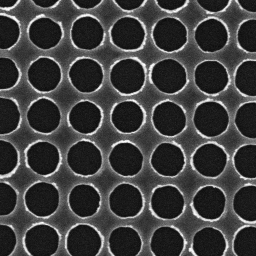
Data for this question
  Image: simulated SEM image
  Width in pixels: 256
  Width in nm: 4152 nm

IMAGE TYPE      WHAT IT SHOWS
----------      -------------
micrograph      a regular array of holes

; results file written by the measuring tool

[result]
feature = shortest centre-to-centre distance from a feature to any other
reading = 671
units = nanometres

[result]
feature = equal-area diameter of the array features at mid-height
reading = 551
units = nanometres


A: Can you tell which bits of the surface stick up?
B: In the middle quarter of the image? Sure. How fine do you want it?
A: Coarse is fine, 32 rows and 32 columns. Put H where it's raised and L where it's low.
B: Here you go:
HHLLLLLLLHHHLLLLLLLLHHLLLLLLLLHH
HLLLLLLLLLHHLLLLLLLLHHLLLLLLLLHH
HLLLLLLLLLHLLLLLLLLLHHLLLLLLLLLH
HLLLLLLLLLHLLLLLLLLLHHLLLLLLLLLH
HHLLLLLLLLHHLLLLLLLLHHLLLLLLLLLH
HHLLLLLLLHHHLLLLLLLLHHHLLLLLLLHH
HHHLLLLLHHHHHLLLLLLHHHHHLLLLLHHH
HHHHHHHHHHHHHHHLHHHHHHHHHHLHHHHH
HHHHHHHHHHHHHHHHHHHHHHHHHHHHHHHH
HHHHLLLHHHHHHHHLLLHHHHHHHLLHHHHH
HHHLLLLLHHHHHLLLLLLHHHHLLLLLLHHH
HHLLLLLLLHHHLLLLLLLHHHLLLLLLLLHH
HLLLLLLLLHHHLLLLLLLLHHLLLLLLLLHH
HLLLLLLLLHHHLLLLLLLLHHLLLLLLLLLH
HLLLLLLLLHHHLLLLLLLLHHLLLLLLLLLH
HHLLLLLLLHHHHLLLLLLHHHHLLLLLLLHH
HHHLLLLLHHHHHHLLLLHHHHHLLLLLLLHH
HHHHHLHHHHHHHHHHHHHHHHHHLLLLLHHH
HHHHHHHHHHHHHHHHHHHHHHHHHHHHHHHH
HHHLLLLHHHHHHHHHHHHHHHHHHHHHHHHH
HHLLLLLLHHHHHLLLLLHHHHHLLLLLHHHH
HLLLLLLLLHHHLLLLLLLHHHHLLLLLLHHH
HLLLLLLLLHHLLLLLLLLLHHLLLLLLLLHH
HLLLLLLLLLHLLLLLLLLLHHLLLLLLLLHH
HLLLLLLLLLHLLLLLLLLLHHLLLLLLLLHH
HLLLLLLLLHHHLLLLLLLHHHLLLLLLLLHH
HHLLLLLLLHHHLLLLLLLHHHHLLLLLLHHH
HHHLLLLLHHHHHHLLLLHHHHHHLLLLHHHH
HHHHHHHHHHHHHHHHHHHHHHHHHHHHHHHH
HHHHHHHHHHHHHHHHHHHHHHHHHHHHHHHH
HHHLLLLHHHHHHLLLLLHHHHHHHLLHHHHH
HHLLLLLLHHHHLLLLLLLHHHHLLLLLLHHH